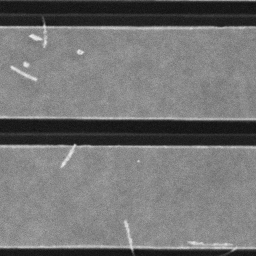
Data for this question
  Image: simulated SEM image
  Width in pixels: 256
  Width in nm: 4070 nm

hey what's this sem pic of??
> lines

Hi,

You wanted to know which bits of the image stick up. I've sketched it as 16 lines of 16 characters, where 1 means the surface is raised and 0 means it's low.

0000000000000000
0000000000000000
1111111111111111
1111111111111111
1111111111111111
1111111111111111
1111111111111111
0000000000000000
0000000000000000
1111111111111111
1111111111111111
1111111111111111
1111111111111111
1111111111111111
1111111111111111
0000000011111111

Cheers